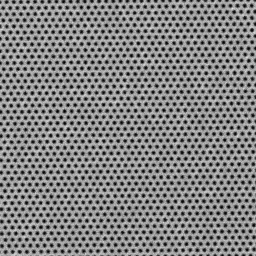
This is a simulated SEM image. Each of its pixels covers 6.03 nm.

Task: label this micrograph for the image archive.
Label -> a regular array of holes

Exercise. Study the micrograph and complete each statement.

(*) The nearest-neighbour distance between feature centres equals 6.83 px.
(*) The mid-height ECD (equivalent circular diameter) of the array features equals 23.6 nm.